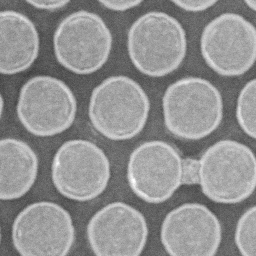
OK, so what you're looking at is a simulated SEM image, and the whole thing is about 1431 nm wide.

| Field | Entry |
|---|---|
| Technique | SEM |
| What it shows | raised bodies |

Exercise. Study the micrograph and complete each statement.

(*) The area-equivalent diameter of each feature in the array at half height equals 316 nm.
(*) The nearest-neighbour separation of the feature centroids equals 0.408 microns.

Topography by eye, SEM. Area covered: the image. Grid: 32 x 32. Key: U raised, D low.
DDDDUUUUDDDDDUUUUDDDDDUUUUDDDDDU
DDDDDDDDDDDDDDDDDDDDDDDDDDDDDDDD
UUUDDDDDUUUUDDDDDDUUUUDDDDDUUUDD
UUUUDDDUUUUUUDDDDUUUUUDDDDUUUUUD
UUUUUDDUUUUUUUDDUUUUUUUDDDUUUUUU
UUUUUDDUUUUUUUDDUUUUUUUDDUUUUUUU
UUUUDDDUUUUUUDDDUUUUUUUDDDUUUUUU
UUUUDDDDUUUUUDDDDUUUUUDDDDUUUUUU
UUUDDDDDDUUUDDDDDDUUUUDDDDDUUUUD
DDDDDDDDDDDDDDDDDDDDDDDDDDDDDDDD
DDDDUUUUDDDDDUUUUDDDDDUUUUDDDDDU
DDDUUUUUUDDDUUUUUUDDDUUUUUUDDDUU
DDDUUUUUUDDDUUUUUUDDDUUUUUUDDDUU
DDUUUUUUUDDUUUUUUUDDDUUUUUUDDDUU
DDDUUUUUUDDUUUUUUUDDDUUUUUUDDDUU
DDDUUUUUDDDDUUUUUUDDDUUUUUUDDDUU
DDDDUUUDDDDDDUUUUDDDDDUUUUDDDDDU
DDDDDDDDDDDDDDDDDDDDDDDDDDDDDDDD
UUUDDDDDUUUUDDDDDDUUUDDDDDDUUUUD
UUUUDDDUUUUUUDDDDUUUUUDDDDUUUUUU
UUUUDDDUUUUUUDDDUUUUUUUUUUUUUUUU
UUUUDDDUUUUUUDDDUUUUUUUUUUUUUUUU
UUUUDDDUUUUUUDDDUUUUUUUUUUUUUUUU
UUUDDDDUUUUUUDDDDUUUUUDDDUUUUUUU
UUDDDDDDDUUUDDDDDDUUUDDDDDUUUUDD
DDDDDDDDDDDDDDDDDDDDDDDDDDDDDDDD
DDDUUUUUDDDDDUUUUDDDDDUUUUDDDDDU
DDUUUUUUUDDDUUUUUUDDDUUUUUUDDDUU
DDUUUUUUUDDUUUUUUUDDDUUUUUUDDDUU
DDUUUUUUUDDUUUUUUUDDUUUUUUUDDDUU
DDUUUUUUUDDDUUUUUUDDDUUUUUUDDDUU
DDDUUUUUDDDDUUUUUDDDDUUUUUUDDDUU